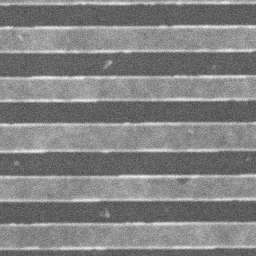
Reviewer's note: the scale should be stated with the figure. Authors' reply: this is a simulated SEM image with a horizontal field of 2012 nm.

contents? lines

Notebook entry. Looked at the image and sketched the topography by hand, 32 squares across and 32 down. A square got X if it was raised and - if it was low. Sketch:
XXXXXXXXXX--XXXXX---------------
--------------------------------
--------------------------------
-----XXXXXXXXXXXXXXXXXXXXXXXXXXX
XXXXXXXXXXXXXXXXXXXXXXXXXXXXXXXX
XXXXXXXXXXXXXXXXXXXXXXXXXXXXXXXX
XXXXXXXXXXXXXXX-----------------
--------------------------------
--------------------------------
--------------------------------
XXXXXXXXXXXXXXXXXXXXXXXXXXXXXXXX
XXXXXXXXXXXXXXXXXXXXXXXXXXXXXXXX
XXXXXXXXXXXXXXXXXXXXXXXXXXXXX---
--------------------------------
--------------------------------
------------------XXXXXXXXXXXXXX
XXXXXXXXXXXXXXXXXXXXXXXXXXXXXXXX
XXXXXXXXXXXXXXXXXXXXXXXXXXXXXXXX
XXXXXXXXXXXXXXXXXXXXXXXXXXXXXXXX
--------------------------------
--------------------------------
--------------------------------
XXXXXXXXXXXXXXXXXXXXXXXXXXXXXXXX
XXXXXXXXXXXXXXXXXXXXXXXXXXXXXXXX
XXXXXXXXXXXXXXXXXXXXXXXXXXXXXXXX
--------------------------------
--------------------------------
--------------------------------
XXXXXXXXXXXXXXXXXXXXXXXXXXXXXXXX
XXXXXXXXXXXXXXXXXXXXXXXXXXXXXXXX
XXXXXXXXXXXXXXXXXXXXXXXXXXXXXXXX
--------------------------------